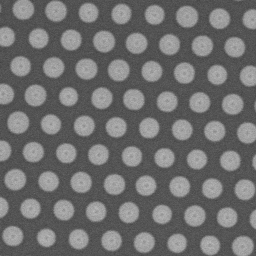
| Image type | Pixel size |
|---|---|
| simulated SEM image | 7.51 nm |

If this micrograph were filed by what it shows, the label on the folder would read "an array of small figures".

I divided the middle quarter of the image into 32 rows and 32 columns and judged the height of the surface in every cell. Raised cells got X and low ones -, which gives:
---XXXXX---XXXXX----XXXX----XXXX
---XXXXX---XXXXX----XXXX----XXXX
---XXXXX---XXXXX----XXXX----XXXX
----XXX-----XXX-----XXXX----XXXX
-----------------------------XX-
--------------------------------
XXX-----XXX-----XX--------------
XXX----XXXXX---XXXXX----XXX-----
XXX----XXXXX---XXXXX---XXXXX----
XXX----XXXXX---XXXXX---XXXXX---X
--------XXX----XXXXX---XXXXX---X
------------------------XXX-----
--------------------------------
---XXXX-----XX------------------
---XXXX----XXXX----XXXX-----XXX-
---XXXXX---XXXX----XXXXX---XXXXX
---XXXX----XXXX----XXXXX---XXXXX
---XXXX----XXXX----XXXX----XXXXX
----------------------------XXX-
--------------------------------
XX-----XXX----------------------
XXX---XXXXX----XXXX-----XX------
XXX---XXXXX----XXXX----XXXX----X
XXX---XXXXX----XXXX----XXXXX---X
XX-----XXX-----XXXX----XXXX----X
-----------------X------XX-----X
--------------------------------
---XXX--------------------------
--XXXXX----XXXX----XXX------XX--
--XXXXX---XXXXX---XXXXX----XXXX-
--XXXXX---XXXXX---XXXXX---XXXXX-
--XXXX----XXXXX---XXXXX----XXXX-